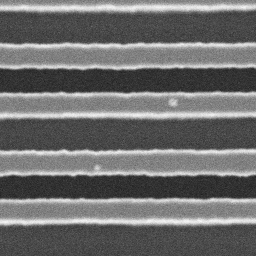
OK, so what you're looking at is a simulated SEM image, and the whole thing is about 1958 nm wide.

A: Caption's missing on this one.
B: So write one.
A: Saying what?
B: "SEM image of lines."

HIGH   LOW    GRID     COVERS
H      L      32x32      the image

HHHHHHHHHHHHHHHHHHHHHHHHHHHHHHHH
LLLLLLLLLLLLLLLLLLLLLLLLLLLLLLLL
LLLLLLLLLLLLLLLLLLLLLLLLLLLLLLLL
LLLLLLLLLLLLLLLLLLLLLLLLLLLLLLLL
LLLLLLLLLLLLLLLLLLLLLLLLLLLLLLLL
LLLLLLLLLLLLLLLLLLLLLLLLHLLLLLLL
HHHHHHHHHHHHHHHHHHHHHHHHHHHHHHHH
HHHHHHHHHHHHHHHHHHHHHHHHHHHHHHHH
LHLLLLLLHLHLLLHHHLLLLLLLLLLLLLLL
LLLLLLLLLLLLLLLLLLLLLLLLLLLLLLLL
LLLLLLLLLLLLLLLLLLLLLLLLLLLLLLLL
LLLLLLLLLLLLLLLLLLLLLLLLLLLLLLLL
HHHHHHHHHHHHHHHHHHHHHHHHHHHHHHHH
HHHHHHHHHHHHHHHHHHHHHHHHHHHHHHHH
LLLLLLLLLLLLLLLLLLLLLLLLLLLLLLLL
LLLLLLLLLLLLLLLLLLLLLLLLLLLLLLLL
LLLLLLLLLLLLLLLLLLLLLLLLLLLLLLLL
LLLLLLLLLLLLLLLLLLLLLLLLLLLLLLLL
LLLLLLLLLLLLLLLLLLLLLLLLLLLLLLLL
HHHHHHHHHHHHHHHHHHHHHHHHHHHHHHHH
HHHHHHHHHHHHHHHHHHHHHHHHHHHHHHHH
HHHHHHHHHHHHHHHHHHHHHHHHHHHHHHHH
LLLLLLLLLLLLLLLLLLLLLLLLLLLLLLLL
LLLLLLLLLLLLLLLLLLLLLLLLLLLLLLLL
LLLLLLLLLLLLLLLLLLLLLLLLLLLLLLLL
HHHHHHHHHHHHHHHHHHHHHHHHHHHHHHHH
HHHHHHHHHHHHHHHHHHHHHHHHHHHHHHHH
HHHHHHHHHHHHHHHHHHHHHHHHHHHHHHHH
LLLLLLLLLLLLLLLLLLLLLLLLLLLLLLLL
LLLLLLLLLLLLLLLLLLLLLLLLLLLLLLLL
LLLLLLLLLLLLLLLLLLLLLLLLLLLLLLLL
LLLLLLLLLLLLLLLLLLLLLLLLLLLLLLLL